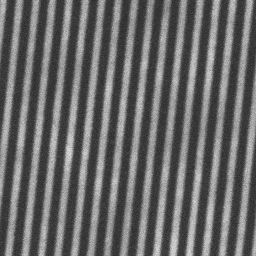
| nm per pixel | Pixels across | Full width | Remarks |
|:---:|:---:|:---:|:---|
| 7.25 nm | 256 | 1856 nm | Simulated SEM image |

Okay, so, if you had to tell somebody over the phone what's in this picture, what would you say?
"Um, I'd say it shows parallel lines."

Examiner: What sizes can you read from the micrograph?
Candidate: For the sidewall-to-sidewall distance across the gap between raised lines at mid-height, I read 74.7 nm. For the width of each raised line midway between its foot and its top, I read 0.0441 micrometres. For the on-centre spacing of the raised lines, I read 118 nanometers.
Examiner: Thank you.